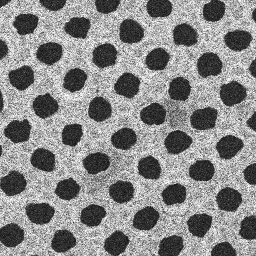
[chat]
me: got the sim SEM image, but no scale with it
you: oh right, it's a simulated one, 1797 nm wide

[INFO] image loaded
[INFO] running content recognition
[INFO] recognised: a regular array of holes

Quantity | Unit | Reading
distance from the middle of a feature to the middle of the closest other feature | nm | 256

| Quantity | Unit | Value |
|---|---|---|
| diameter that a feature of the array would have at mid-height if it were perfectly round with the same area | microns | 0.166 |